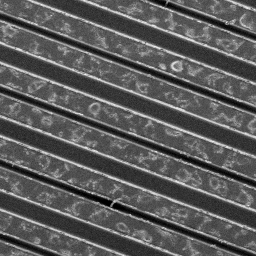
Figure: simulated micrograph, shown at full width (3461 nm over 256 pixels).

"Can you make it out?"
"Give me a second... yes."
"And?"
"parallel lines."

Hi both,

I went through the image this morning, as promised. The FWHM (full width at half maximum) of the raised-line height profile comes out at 298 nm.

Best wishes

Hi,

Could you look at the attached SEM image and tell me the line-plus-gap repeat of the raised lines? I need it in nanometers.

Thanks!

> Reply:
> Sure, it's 466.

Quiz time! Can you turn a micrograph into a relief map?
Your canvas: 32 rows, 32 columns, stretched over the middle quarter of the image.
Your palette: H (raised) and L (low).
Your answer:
HHHHHHHHHHHHHHHLLLLLHHHHHHHHHHHH
LLHHHHHHHHHHHHHHHHLLLLLHHHHHHHHH
LLLLLHHHHHHHHHHHHHHHHLLLLLHHHHHH
LLLLLLLHHHHHHHHHHHHHHHHLLLLLHHHH
LLLLLLLLLLHHHHHHHHHHHHHHHHLLLLLH
LLLLLLLLLLLLLHHHHHHHHHHHHHHHLLLL
HHHLLLLLLLLLLLLLHHHHHHHHHHHHHHHL
HHHHHLLLLLLLLLLLLLHHHHHHHHHHHHHH
HHHHHHHHLLLLLLLLLLLLLHHHHHHHHHHH
HHHHHHHHHHHLLLLLLLLLLLLLHHHHHHHH
HHHHHHHHHHHHHHLLLLLLLLLLLLHHHHHH
HHHHHHHHHHHHHHHHLLLLLLLLLLLLLHHH
LLLHHHHHHHHHHHHHHHHLLLLLLLLLLLLL
HLLLLLHHHHHHHHHHHHHHHHLLLLLLLLLL
HHHLLLLLLHHHHHHHHHHHHHHHLLLLLLLL
HHHHHHLLLLLHHHHHHHHHHHHHHHHLLLLL
HHHHHHHHHLLLLLHHHHHHHHHHHHHHHHLL
HHHHHHHHHHHLLLLLLHHHHHHHHHHHHHHH
HHHHHHHHHHHHHHLLLLLHHHHHHHHHHHHH
LHHHHHHHHHHHHHHHHLLLLLHHHHHHHHHH
LLLLHHHHHHHHHHHHHHHHLLLLLHHHHHHH
LLLLLLHHHHHHHHHHHHHHHHLLLLLHHHHH
LLLLLLLLLHHHHHHHHHHHHHHHHLLLLLHH
LLLLLLLLLLLLHHHHHHHHHHHHHHHHLLLL
HHLLLLLLLLLLLLLHHHHHHHHHHHHHHHLL
HHHHLLLLLLLLLLLLLHHHHHHHHHHHHHHH
HHHHHHHLLLLLLLLLLLLLHHHHHHHHHHHH
HHHHHHHHHHLLLLLLLLLLLLLHHHHHHHHH
HHHHHHHHHHHHHLLLLLLLLLLLLHHHHHHH
HHHHHHHHHHHHHHHLLLLLLLLLLLLLHHHH
LLHHHHHHHHHHHHHHHHLLLLLLLLLLLLLH
LLLLLHHHHHHHHHHHHHHHHLLLLLLLLLLL